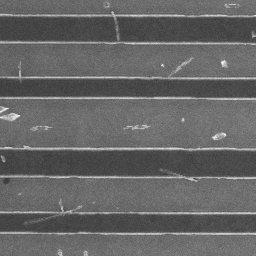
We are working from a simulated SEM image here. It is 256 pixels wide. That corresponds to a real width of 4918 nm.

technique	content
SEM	lines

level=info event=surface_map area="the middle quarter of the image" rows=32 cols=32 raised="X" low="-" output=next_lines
--------------------------------
--------------------------------
--------------------------------
XXXX----X-----------------------
XXXXXXXXXXXXXXXXXXXXXXXXXXXXXXXX
XXXXXXXXXXXXXXXXXXXXXXXXXXXXXXXX
XXXXXXXXXXXXXXXXXXXXXXXXXXXXXXXX
XXXXXXXXXXXXXXXXXXXXXXXXXXXXXXXX
XXXXXXXXXXX---XXXXXXXXXXXXXXXXXX
--------------------------------
--------------------------------
--------------------------------
--------------------------------
--------------------------------
--------------------------------
--------------------------------
--------------------------------
--------------------------------
--------------------------------
--------------------------------
--------------------------------
XXXXXXXXXXXXXXXXXXXXXXXXXXXXXXXX
XXXXXXXXXXXXXXXXXXXXXXXXXXXXXXXX
XXXXXXXXXXXXXXXXXXXXXXXXXXXXXXXX
XXXXXXXXXXXXXXXXXXXXXXXXXXXXXXXX
XXXXXXXXXXXXXXXXXXXXXXXXXXXXXXXX
XXXXXXXXXXXXXXXXXXXXXXXXXXXXXXXX
XXXXXXXXXXXXXXXXXXXXXXXXXXXXXXXX
------------------------------XX
--------------------------------
--------------------------------
--------------------------------